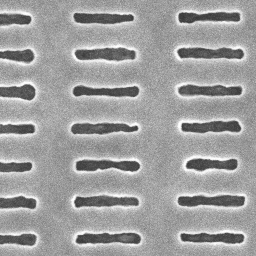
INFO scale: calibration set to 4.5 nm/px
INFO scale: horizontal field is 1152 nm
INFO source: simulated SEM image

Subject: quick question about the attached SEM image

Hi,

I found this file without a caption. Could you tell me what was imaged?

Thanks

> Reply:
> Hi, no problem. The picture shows a regular array of holes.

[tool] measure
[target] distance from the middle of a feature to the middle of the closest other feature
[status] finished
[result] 163 nanometres